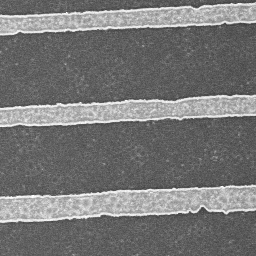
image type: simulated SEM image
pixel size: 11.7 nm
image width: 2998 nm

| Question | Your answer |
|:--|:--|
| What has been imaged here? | one or a few lines or trenches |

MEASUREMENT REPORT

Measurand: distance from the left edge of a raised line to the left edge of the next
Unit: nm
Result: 1080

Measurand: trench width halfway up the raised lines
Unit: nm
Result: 843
